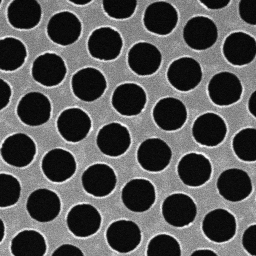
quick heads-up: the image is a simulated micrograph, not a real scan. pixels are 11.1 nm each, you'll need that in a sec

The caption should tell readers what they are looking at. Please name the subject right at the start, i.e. a regular array of holes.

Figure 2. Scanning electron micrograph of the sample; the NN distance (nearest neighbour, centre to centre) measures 475 nm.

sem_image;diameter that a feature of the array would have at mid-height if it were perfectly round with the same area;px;34.3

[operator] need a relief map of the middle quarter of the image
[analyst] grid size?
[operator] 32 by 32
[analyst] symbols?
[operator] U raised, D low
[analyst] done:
UUUUUUUUUUUUUUUUDDDDDDDDUUDDDDDD
DUUUDDDDDUUUUUUUUDDDDDDUUUDDDDDD
DUUDDDDDDDUUUUUUUUDDDDUUUUDDDDDD
UUDDDDDDDDUUUUUUUUUUUUUUUUDDDDDD
UUDDDDDDDDDUUUUUUUUUUUUUUUDDDDDD
UUDDDDDDDDDUUUDDDDDUUUUUUUUDDDDD
UUDDDDDDDDUUUDDDDDDDUUUUUUUUDDDD
UUDDDDDDDDUUDDDDDDDDUUUUUUUUUUUU
UUUDDDDDDUUUDDDDDDDDDUUUUDDUUUUU
UUUUUUUUUUUUDDDDDDDDDUUDDDDDDDUU
UUUUUUUUUUUUDDDDDDDDUUUDDDDDDDUU
DDDDDUUUUUUUUDDDDDDDUUDDDDDDDDDU
DDDDDDUUUUUUUUDDDDDUUUDDDDDDDDDU
DDDDDDUUUUUUUUUUUUUUUUDDDDDDDDDU
DDDDDDDUUUUUUUUUUUUUUUUDDDDDDDUU
DDDDDDDUUUDDDDDUUUUUUUUUDDDDDDUU
DDDDDDUUUDDDDDDDUUUUUUUUUDDDUUUU
DDDDDDUUDDDDDDDDUUUUUUUUUUUUUUUU
DDDDDUUUDDDDDDDDDUUUUUUUUUUUUUUU
UUDDUUUUDDDDDDDDDUUUDDDDDUUUUUUU
UUUUUUUUDDDDDDDDUUUDDDDDDDUUUUUU
UUUUUUUUUDDDDDDDUUDDDDDDDDDUUUUU
DDUUUUUUUUDDDDDUUUDDDDDDDDDUUUUD
DDDUUUUUUUUUUUUUUUDDDDDDDDDUUDDD
DDDUUUUUUUUUUUUUUUUDDDDDDDUUUDDD
DDDUUUUDDDDUUUUUUUUDDDDDDDUUDDDD
DDDUUDDDDDDDUUUUUUUUDDDDDUUUDDDD
DDUUUDDDDDDDDUUUUUUUUUUUUUUUDDDD
DUUUDDDDDDDDDUUUUUUUUUUUUUUUUDDD
UUUUDDDDDDDDDUUUDDDDDDUUUUUUUUDD
UUUUUDDDDDDDDUUDDDDDDDUUUUUUUUUD
UUUUUDDDDDDDUUDDDDDDDDDUUUUUUUUU